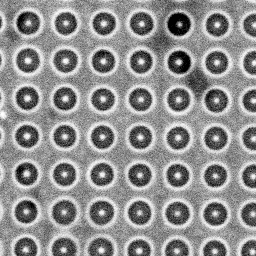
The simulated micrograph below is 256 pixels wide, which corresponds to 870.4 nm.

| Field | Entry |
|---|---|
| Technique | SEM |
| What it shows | an array of small figures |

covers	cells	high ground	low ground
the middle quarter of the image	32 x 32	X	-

---XXXX------XXX------XXXX------
---XXXXX----XXXXX-----XXXX-----X
XXXXXXXXX-XXXXXXXXX-XXXXXXX---XX
XXXXXXXXXXXXXXXXXXXXXXXXXXXXXXXX
XXXXXXXXXXXXXXXXXXXXXXXXXXXXXXXX
XXXXXXXXXXXXXXXXXXXXXXXXXXXXXXXX
--XXXXXX----XXXXX----XXXXXX----X
---XXXX------XXX------XXXX-----X
X---XXX--X---XXX------XXXX------
---XXXX------XXX------XXXX------
---XXXX-----XXXXX-----XXXX-----X
--XXXXXX----XXXXX----XXXXXX----X
XXXXXXXXXXXXXXXXXXXXXXXXXXXXXXXX
XXXXXXXXXXXXXXXXXXXXXXXXXXXXXXXX
XXXXXXXXXXXXXXXXXXXXXXXXXXXXXXXX
--XXXXXX---XXXXXXX---XXXXXXX-XXX
---XXXX-----XXXX------XXXX-----X
---XXX-------XXX------XXXX-----X
---XXX-------XXX---X--XXX---X---
---XXXX-----XXXX------XXXX-----X
--XXXXX-----XXXXX----XXXXX-----X
XXXXXXXXX-XXXXXXXXXXXXXXXXXX--XX
XXXXXXXXXXXXXXXXXXXXXXXXXXXXXXXX
XXXXXXXXXXXXXXXXXXXXXXXXXXXXXXXX
XXXXXXXXX-XXXXXXXXXXXXXXXXXXXXXX
---XXXX-----XXXXX----XXXXX----XX
---XXXX-----XXXX------XXXX-----X
---XXX---X---XXX------XXX---X---
---XXX-------XXX------XXXX-----X
---XXXX-----XXXXX-----XXXX-----X
--XXXXXX---XXXXXX----XXXXXX---XX
XXXXXXXXXXXXXXXXXXXXXXXXXXXXXXXX